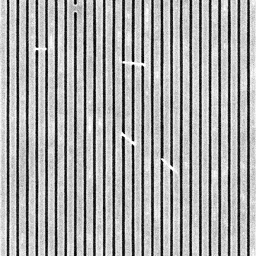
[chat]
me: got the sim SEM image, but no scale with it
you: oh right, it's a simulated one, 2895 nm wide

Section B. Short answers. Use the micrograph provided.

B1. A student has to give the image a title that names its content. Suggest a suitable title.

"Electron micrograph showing parallel lines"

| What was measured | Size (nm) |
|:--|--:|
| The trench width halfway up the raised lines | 39.6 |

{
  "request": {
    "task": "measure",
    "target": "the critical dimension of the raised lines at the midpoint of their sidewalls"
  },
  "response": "72.1 nm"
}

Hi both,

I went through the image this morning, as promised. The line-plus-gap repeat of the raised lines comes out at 109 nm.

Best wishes